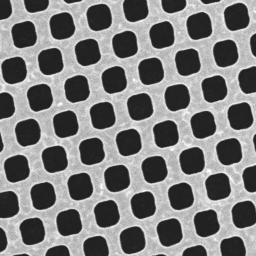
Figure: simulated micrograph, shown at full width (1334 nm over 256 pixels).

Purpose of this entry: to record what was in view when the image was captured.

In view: a regular array of holes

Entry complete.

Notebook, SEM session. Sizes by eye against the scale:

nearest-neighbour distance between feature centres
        193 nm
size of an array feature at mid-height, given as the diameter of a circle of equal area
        141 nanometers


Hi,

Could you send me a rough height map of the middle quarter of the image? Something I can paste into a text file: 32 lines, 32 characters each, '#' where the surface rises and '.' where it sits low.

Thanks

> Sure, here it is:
#####.#############......###....
##########.....####......###....
##########.....####......####...
#.....###.......###......#######
......###.......###.....########
......####......###########....#
......####.....##########......#
......############...####......#
......##########......###......#
##..######.#####......###......#
#######.....####......####.....#
#######......###......####...###
...###.......###......##########
...####......####....###########
...####......############..####.
....###.....###########.....####
....###########...####.......###
...##########......###.......###
#######..####......####......###
####.....####......####.....####
####......###......####....#####
####......####.....###########..
.###......####....###########...
.###......###########....####...
.####....###########.....####...
.###########...####.......###...
##########......###.......###...
###...####......####......####..
#......###......####.....#######
#......###.......####...########
#......###......###########.....
#......####....###########......